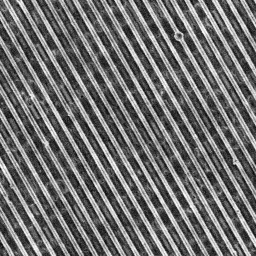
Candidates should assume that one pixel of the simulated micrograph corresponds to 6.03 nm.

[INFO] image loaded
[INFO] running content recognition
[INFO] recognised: parallel lines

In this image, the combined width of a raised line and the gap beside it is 0.0729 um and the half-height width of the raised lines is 17.6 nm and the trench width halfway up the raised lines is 53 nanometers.